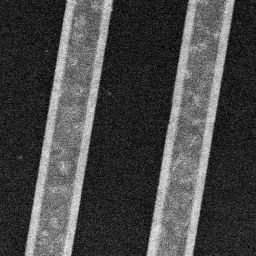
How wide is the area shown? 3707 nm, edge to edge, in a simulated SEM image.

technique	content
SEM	one or a few lines or trenches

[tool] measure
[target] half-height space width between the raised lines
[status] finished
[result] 1210 nanometres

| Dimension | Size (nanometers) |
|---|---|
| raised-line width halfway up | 530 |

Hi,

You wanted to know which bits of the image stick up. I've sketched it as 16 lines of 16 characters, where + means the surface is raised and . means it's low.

....+++.....++..
....+++.....++..
....++......++..
....++.....+++..
....++.....+++..
....++.....++...
...+++.....++...
...+++.....++...
...++......++...
...++......++...
...++.....+++...
...++.....++....
..+++.....++....
..+++.....++....
..++......++....
..++......++....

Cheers